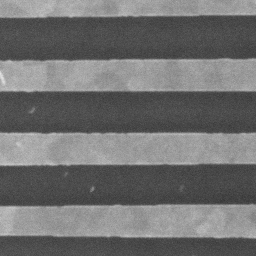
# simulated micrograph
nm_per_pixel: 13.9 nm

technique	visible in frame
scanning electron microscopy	lines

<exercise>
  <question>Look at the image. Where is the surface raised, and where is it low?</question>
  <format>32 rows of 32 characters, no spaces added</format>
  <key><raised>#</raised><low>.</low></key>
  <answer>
################################
################################
................................
................................
................................
................................
................................
...........................##..#
################################
################################
################################
................................
................................
................................
................................
................................
................................
################################
################################
################################
#####.##........................
................................
................................
................................
................................
................................
################################
################################
################################
...............#################
................................
................................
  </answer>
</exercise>